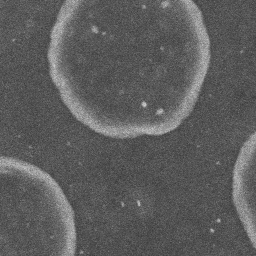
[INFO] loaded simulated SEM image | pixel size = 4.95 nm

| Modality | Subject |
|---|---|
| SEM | raised bodies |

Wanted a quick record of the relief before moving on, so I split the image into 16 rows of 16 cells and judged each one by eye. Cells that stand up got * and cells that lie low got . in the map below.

....********....
....********....
...**********...
...**********...
...**********...
....********....
.....*******....
......*****.....
................
...............*
**.............*
***............*
****...........*
****...........*
****............
****............